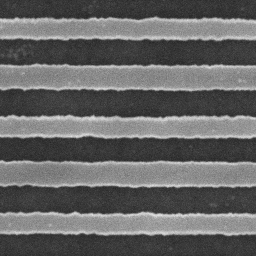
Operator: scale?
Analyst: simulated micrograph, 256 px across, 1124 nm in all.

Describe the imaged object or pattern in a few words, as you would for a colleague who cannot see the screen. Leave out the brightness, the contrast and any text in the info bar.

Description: lines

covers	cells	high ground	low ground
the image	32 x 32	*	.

................................
................................
*******************************.
********************************
********************************
................................
................................
................................
********************************
********************************
********************************
................................
................................
................................
.*..............................
********************************
********************************
................................
................................
................................
********************************
********************************
********************************
................................
................................
................................
................................
********************************
********************************
................................
................................
................................